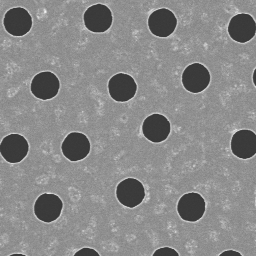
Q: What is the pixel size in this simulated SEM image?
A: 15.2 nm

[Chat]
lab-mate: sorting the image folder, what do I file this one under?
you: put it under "a regular array of holes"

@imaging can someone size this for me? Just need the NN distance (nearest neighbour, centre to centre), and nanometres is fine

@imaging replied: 978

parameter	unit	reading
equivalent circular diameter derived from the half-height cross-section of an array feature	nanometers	436